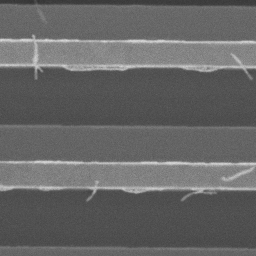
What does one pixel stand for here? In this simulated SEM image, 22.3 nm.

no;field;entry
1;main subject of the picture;lines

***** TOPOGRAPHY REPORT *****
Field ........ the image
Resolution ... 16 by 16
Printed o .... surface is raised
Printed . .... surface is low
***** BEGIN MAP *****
oooooooooooooooo
oooooooooooooooo
oooooooooooooooo
oooooooooooooooo
................
................
................
................
oooooooooooooooo
oooooooooooooooo
oooooooooooooooo
oooooooooooooooo
................
................
................
ooooo...........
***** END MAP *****